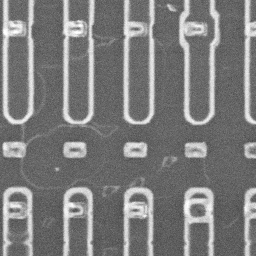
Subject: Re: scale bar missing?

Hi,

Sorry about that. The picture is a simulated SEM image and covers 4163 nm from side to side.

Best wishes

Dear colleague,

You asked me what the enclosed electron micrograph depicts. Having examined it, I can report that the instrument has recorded wiring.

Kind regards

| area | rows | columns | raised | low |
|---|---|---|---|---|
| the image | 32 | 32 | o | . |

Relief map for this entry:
.ooo....ooo.....ooo....ooo.....o
.ooo....ooo.....ooo....oooo....o
.ooo....ooo.....ooo....oooo....o
.ooo....ooo.....ooo....oooo....o
.ooo....ooo.....ooo....oooo....o
.ooo....ooo.....ooo....oooo....o
.ooo....ooo.....ooo....ooo.....o
.ooo....ooo.....ooo....ooo.....o
.ooo....ooo.....ooo....ooo.....o
.ooo....ooo.....ooo....ooo.....o
.ooo....ooo.....ooo....ooo.....o
.ooo....ooo.....ooo....ooo.....o
.ooo....ooo.....ooo....ooo.....o
.ooo....ooo.....ooo....ooo.....o
.ooo....ooo.....ooo....ooo.....o
................................
................................
................................
.oo.....oo......oo......o......o
................................
................................
................................
................................
................................
.ooo....ooo.....ooo.....oo.....o
.ooo....ooo.....ooo....ooo.....o
.ooo....ooo.....ooo....ooo.....o
.ooo....ooo.....ooo....ooo.....o
.ooo....ooo.....ooo....ooo.....o
.ooo....ooo.....ooo....ooo.....o
.ooo....ooo.....ooo....ooo.....o
.ooo....ooo.....ooo....ooo.....o